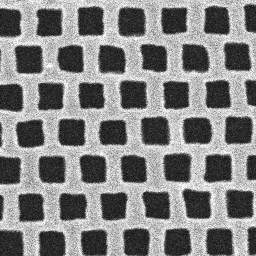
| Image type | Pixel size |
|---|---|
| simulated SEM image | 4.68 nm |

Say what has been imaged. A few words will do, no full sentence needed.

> a regular array of holes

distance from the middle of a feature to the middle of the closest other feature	192	nm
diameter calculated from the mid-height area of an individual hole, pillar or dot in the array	140	nm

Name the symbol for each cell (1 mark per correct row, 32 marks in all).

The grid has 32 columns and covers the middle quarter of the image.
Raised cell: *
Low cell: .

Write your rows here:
.....****......****.......****..
.....****......*****......****..
********************************
********************************
****..********......*****......*
****......****.......****......*
****......****.......****......*
****......****.......****......*
****......****.......****......*
****......****.......****......*
****......****.......****......*
********************************
********************************
********************......*****.
.....****......****.......****..
......***.......***.......****..
......***.......***........***..
.....****.......***........***..
.....****.......***........***..
......***.......****......****..
*....***************************
********************************
**************************.....*
****......****......*****.......
****.......***.......****.......
****.......***.......****.......
.***.......***.......****.......
****.......***.......****......*
****.......***.......****......*
*****.....*****.....******.....*
********************************
******************************..